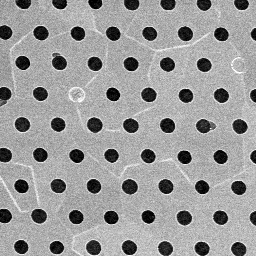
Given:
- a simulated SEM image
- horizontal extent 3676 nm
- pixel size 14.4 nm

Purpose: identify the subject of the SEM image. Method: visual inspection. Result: a regular array of holes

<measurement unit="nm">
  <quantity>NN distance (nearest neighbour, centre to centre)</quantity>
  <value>504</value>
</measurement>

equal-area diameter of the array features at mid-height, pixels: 14.9